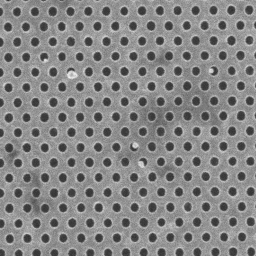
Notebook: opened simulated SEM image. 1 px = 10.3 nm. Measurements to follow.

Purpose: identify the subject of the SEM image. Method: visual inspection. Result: a regular array of holes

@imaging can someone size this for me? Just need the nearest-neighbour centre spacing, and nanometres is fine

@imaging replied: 178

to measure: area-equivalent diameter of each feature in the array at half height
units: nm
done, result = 95.4